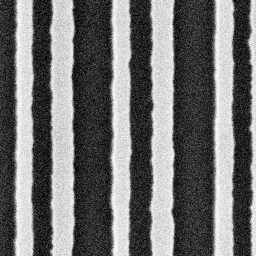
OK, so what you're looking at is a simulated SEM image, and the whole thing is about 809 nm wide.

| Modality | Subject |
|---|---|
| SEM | lines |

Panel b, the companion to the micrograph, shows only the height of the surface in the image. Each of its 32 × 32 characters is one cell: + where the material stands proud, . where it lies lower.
..++...++.....++...+++.....++...
..++...++.....++...+++.....++..+
..++...++.....++...+++.....++..+
..++..+++.....++...+++.....++..+
..++..+++.....++...+++.....++..+
..++...++.....++...+++.....++..+
..++...++.....++...+++.....++..+
..++...++.....++...+++.....++..+
..++..+++.....++...+++.....++...
..++..+++.....++...+++.....++...
..++..+++.....++...+++.....++...
..++...++.....++...+++.....++..+
..++...++.....++...+++.....++...
..++...++.....++...+++.....++...
..++...++.....++...+++.....++...
..++...++.....++...+++.....++..+
..++...++.....++...+++.....++..+
..++...++.....++...+++.....++...
..++...++.....++...+++.....++...
..++...++.....++...+++.....++...
..++...++.....++...+++.....++..+
..++...++.....++...+++.....++...
..++...++.....++...+++.....++...
..++...++.....++...+++.....++...
..++...++.....++...+++.....++...
..++..+++.....++...+++.....++...
..++...++.....++...++......++..+
..++...++.....++...+++.....++..+
..++...++.....++...+++.....++...
..++...++.....++...+++.....++...
..++...++.....++...+++.....++...
..++...++.....++...+++.....++...